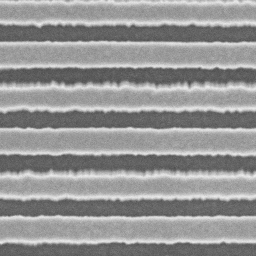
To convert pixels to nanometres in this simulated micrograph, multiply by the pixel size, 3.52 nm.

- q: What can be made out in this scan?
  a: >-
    lines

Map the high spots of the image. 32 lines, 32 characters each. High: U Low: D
UUUUUUUUUUUUUUUUUUUUUUUUUUUUUUUU
UUUUUUUUUUUUUUUUUUUUUUUUUUUUUUUU
UUUUUUUUUUUUUUUUUUUUUUUUUUUUUUUU
DDDDDDDDDDDDDDDDDDDDDDDDDDDDDDDD
DDDDDDDDDDDDDDDDDDDDDDDDDDDDDDDD
UUUUUUUUUUUUUUUUUUUUUUUUUUUUUUUU
UUUUUUUUUUUUUUUUUUUUUUUUUUUUUUUU
UUUUUUUUUUUUUUUUUUUUUUUUUUUUUUUU
DDDDDDDDDDDDDDDDDDDDDDDDDDDDDDDD
DDDDDDDDDDDDDDDDDDDDDDDDDDDDDDDD
DDDDDDDDDDDDDDDDDDDDDDDDDDDDDDDD
UUUUUUUUUUUUUUUUUUUUUUUUUUUUUUUU
UUUUUUUUUUUUUUUUUUUUUUUUUUUUUUUU
UUUUUUUUUUUUUUUUUUUUUUUUUUUUUUUU
DDDDDDDDDDDDDDDDDDDDDDDDDDDDDDDD
DDDDDDDDDDDDDDDDDDDDDDDDDDDDDDDD
UUUUUUUUUUUUUUUUUUUUUUUUUUUUUUUU
UUUUUUUUUUUUUUUUUUUUUUUUUUUUUUUU
UUUUUUUUUUUUUUUUUUUUUUUUUUUUUUUU
DDDDDDDDDDDDDDDDDDDDDDDDDDDDDDDD
DDDDDDDDDDDDDDDDDDDDDDDDDDDDDDDD
DDDDDDDDDDDDDDDDDDDDDDDDDDDDDDDD
UUUUUUUUUUUUUUUUUUUUUUUUUUUUUUUU
UUUUUUUUUUUUUUUUUUUUUUUUUUUUUUUU
UUUUUUUUUUUUUUUUUUUUUUUUUUUUUUUU
DDDDDDDDDDDDDDDDDDDDDDDDDDDDDDDD
DDDDDDDDDDDDDDDDDDDDDDDDDDDDDDDD
UUUUUUUUUUUUUUUUUUUUUUUUUUUUUUUU
UUUUUUUUUUUUUUUUUUUUUUUUUUUUUUUU
UUUUUUUUUUUUUUUUUUUUUUUUUUUUUUUU
DDDDDDDDDDDDDDDDDDDDDDDDDDDDDDDD
DDDDDDDDDDDDDDDDDDDDDDDDDDDDDDDD